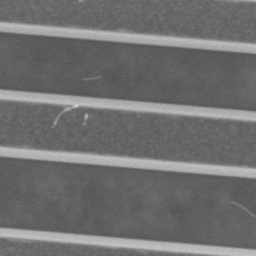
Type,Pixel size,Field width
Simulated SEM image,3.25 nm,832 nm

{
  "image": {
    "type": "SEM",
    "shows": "one or a few lines or trenches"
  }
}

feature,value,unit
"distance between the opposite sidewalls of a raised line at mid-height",186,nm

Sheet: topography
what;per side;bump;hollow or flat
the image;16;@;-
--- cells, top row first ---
@@@@@@@@@@@@@@@@
@@@@@@@@@@@@@@@@
---------@@@@@@@
----------------
----------------
----------------
@@@@@@@---------
@@@@@@@@@@@@@@@@
@@@@@@@@@@@@@@@@
@@@@@@@@@@@@@@@@
------------@@@@
----------------
----------------
----------------
----------------
@@@@@@@@@@@@----